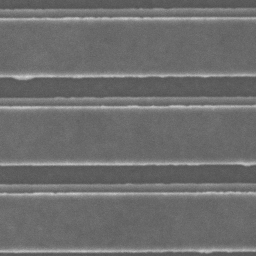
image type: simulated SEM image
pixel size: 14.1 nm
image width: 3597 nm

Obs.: lines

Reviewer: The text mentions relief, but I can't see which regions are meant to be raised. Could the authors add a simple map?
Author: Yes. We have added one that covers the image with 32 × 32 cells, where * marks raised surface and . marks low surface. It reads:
................................
********************************
********************************
********************************
********************************
********************************
********************************
********************************
********************************
*******************.*....*......
................................
................................
********************************
********************************
********************************
********************************
********************************
********************************
********************************
********************************
*************************.....**
................................
................................
********************************
********************************
********************************
********************************
********************************
********************************
********************************
********************************
..*......................*......